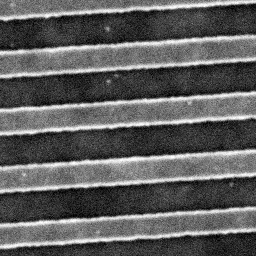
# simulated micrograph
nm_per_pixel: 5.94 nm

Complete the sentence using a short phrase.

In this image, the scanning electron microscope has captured lines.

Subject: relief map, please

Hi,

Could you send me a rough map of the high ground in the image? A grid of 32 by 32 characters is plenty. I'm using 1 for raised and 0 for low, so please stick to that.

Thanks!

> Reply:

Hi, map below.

11111111111111111111111111111000
11111111111110000000000000000000
00000000000000000000000000000000
00000000000000000000000000000000
00000000000000000000000000000000
00000000000000011111111111111111
11111111111111111111111111111111
11111111111111111111111111111111
11111111111111111000000000000000
11100000000000000000000000000000
00000000000000000000000000000000
00000000000000000000000000000000
00000000000000000111111111111111
00111111111111111111111111111111
11111111111111111111111111111111
11111111111111111111000000000000
11111000000000000000000000000000
00000000000000000000000000000000
00000000000000000000000000000000
00000000000000000000001111111111
00000001111111111111111111111111
11111111111111111111111111111111
11111111111111111111111000000000
11111111000000000000000000000000
00000000000000000000000000000000
00000000000000000000000000000000
00000000000000000000000011111111
00000000011111111111111111111111
11111111111111111111111111111111
11111111111111111111110000000000
11111100000000000000000000000000
00000000000000000000000000000000